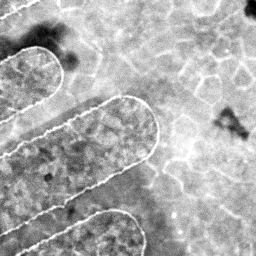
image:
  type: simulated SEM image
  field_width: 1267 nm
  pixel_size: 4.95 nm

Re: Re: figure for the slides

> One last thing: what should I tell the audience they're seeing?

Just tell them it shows one or a few lines or trenches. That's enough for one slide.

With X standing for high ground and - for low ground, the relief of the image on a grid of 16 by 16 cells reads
X---------------
----------------
----------------
-XX-------------
XXXX------------
XXXX------------
XX----XXX-------
----XXXXXX------
---XXXXXXX------
-XXXXXXXX-------
XXXXXXXX--------
XXXXXX----------
XXXX------------
XX----XX--------
X---XXXXX-------
--XXXXXXX-------